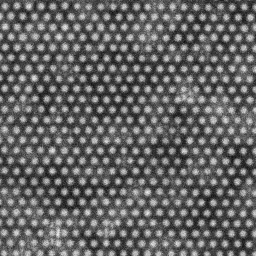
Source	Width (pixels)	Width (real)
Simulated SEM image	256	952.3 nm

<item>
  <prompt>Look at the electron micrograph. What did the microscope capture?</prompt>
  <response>a regular array of raised bodies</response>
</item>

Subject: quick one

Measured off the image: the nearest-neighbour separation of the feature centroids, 11.3 pixels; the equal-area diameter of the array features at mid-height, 0.0222 microns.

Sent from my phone